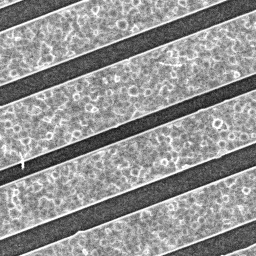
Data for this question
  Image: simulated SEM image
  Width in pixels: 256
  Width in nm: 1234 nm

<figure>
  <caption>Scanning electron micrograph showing one or a few lines or trenches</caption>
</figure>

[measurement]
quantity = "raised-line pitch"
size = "0.341 µm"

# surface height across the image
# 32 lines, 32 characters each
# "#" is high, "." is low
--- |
#........##################.....
.......#################........
....##################.......###
.##################.......######
#################......#########
##############.......###########
###########.......##############
########.......#################
######.......###################
###.......#####################.
#.......#####################...
.....#####################.....#
..#####################.....####
#####################.....######
##################.....#########
###############......###########
#############.....##############
##########.....#################
#######......#################..
#####.....##################....
##.....##################.......
.....#################........##
..##################........####
#################........#######
##############........##########
############........############
#########........###############
######........##################
####........#################...
#........##################.....
.......#################........
....#################........###